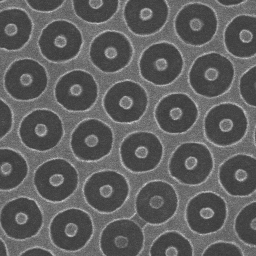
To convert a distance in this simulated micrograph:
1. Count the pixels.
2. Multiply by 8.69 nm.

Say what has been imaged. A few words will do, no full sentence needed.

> a regular array of ring-shaped grooves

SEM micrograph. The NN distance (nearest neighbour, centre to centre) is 447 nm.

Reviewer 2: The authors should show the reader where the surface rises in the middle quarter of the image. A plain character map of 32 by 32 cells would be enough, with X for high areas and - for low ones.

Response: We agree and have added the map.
XXXXXXXX-------XXXX----XXX----XX
XXXXXXXXX-----XXXXX-----X----XXX
X------XXXXXXXXXXXX----------XX-
-------XXXXXXXXXXXXX--------XXX-
--------XXXXXX---XXXXX-----XXXX-
--XX----XXXX-------XXXXXXXXXXXXX
-XXX----XXX---------XXXXXXXXXXXX
--XX----XXX---------XXXXXXX--XXX
--------XX-----XX----XXXX------X
--------XX----XXX----XXX--------
-------XXX----XXX----XX---------
XX---XXXXX----------XXX----XX---
XXXXXXXXXXX---------XXX----XX---
XXXXXXXXXXXX-------XXXX----XX---
XXXXX-----XXX---XXXXXXX---------
XXXX-------XXXXXXXXXXXXX--------
XXX---------XXXXXXXXXXXXX------X
XX----------XXXXX-----XXXXXXXXXX
XX---XXX----XXXX-------XXXXXXXXX
XX---XXX----XXX---------XXXXXXXX
XX----XX----XX----------XXXXX---
XX----------XX----XXX----XXX----
XXX--------XXX----XXX---XXX-----
XXXX-----XXXXX----------XXX----X
-XXXXXXXXXXXXXX---------XX----XX
--XXXXXXXXXXXXX--------XXX----XX
---XXXXXXXXXXXXXX----XXXXX------
---XXXX-------XXXXXXXXXXXXX-----
---XXX---------XXXXXXXXXXXXX----
---XXX----------XXXXXX---XXXX---
---XX-----X-----XXXX-------XXXXX
---XX----XXX----XXX---------XXXX